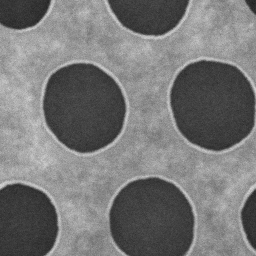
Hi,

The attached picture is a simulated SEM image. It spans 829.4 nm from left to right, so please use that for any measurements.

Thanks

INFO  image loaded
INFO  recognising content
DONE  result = holes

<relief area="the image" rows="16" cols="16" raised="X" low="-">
---XXXX-----XXXX
--XXXXXX---XXXXX
XXXXXXXXXXXXXXXX
XXXXXXXXXXXXXXXX
XXX----XXXX----X
XXX----XXXX-----
XXX-----XXX-----
XXX-----XXX-----
XXX----XXXXX---X
XXXXX-XXXXXXXXXX
XXXXXXXXXXXXXXXX
XXXXXXXX---XXXXX
---XXXX-----XXX-
----XXX-----XXX-
----XXX-----XXX-
---XXXX-----XXXX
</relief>